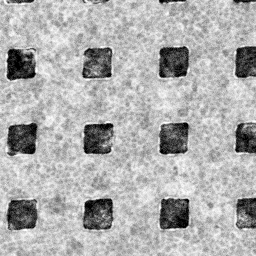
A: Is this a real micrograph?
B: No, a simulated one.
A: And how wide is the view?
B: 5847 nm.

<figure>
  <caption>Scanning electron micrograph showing a regular array of holes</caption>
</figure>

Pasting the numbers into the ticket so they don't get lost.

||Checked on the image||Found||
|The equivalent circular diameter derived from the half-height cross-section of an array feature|779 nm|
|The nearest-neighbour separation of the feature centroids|1720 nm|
